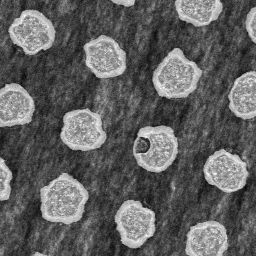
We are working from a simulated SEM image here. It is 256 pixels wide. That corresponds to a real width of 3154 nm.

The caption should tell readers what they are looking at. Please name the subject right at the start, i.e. a regular array of raised bodies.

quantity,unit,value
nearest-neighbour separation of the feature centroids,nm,898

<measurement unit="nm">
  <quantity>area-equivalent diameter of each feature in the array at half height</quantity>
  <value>484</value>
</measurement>